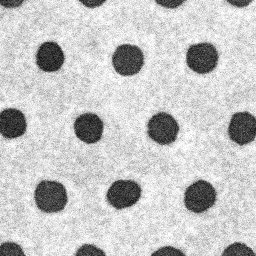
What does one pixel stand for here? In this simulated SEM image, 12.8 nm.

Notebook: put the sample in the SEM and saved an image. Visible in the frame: a regular array of holes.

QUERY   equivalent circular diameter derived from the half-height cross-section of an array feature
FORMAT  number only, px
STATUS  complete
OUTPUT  33.3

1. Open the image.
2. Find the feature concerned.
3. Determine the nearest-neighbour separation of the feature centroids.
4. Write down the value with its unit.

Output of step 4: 949 nanometres